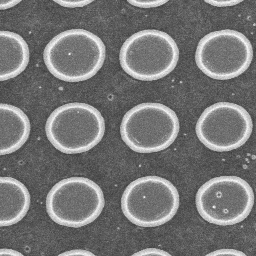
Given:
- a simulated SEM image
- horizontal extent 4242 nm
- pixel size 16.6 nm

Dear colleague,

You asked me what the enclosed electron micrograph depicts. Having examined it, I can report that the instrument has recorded a regular array of raised bodies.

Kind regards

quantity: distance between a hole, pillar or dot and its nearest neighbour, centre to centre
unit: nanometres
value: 1200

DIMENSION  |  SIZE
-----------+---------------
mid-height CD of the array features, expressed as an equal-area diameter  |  825 nm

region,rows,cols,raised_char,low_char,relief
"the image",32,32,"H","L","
HHLLLLLLHHLLLLLLLHHHLLLLLLLHLLLL
LLLLLLLLLLLLLLLLLLLLLLLLLLLLLLLL
LLLLLLLLLLLLLLLLLLLLLLLLLLLLLLLL
LLLLLLLLLLLLLLLLLLLLLLLLLLLLLLLL
HHLLLLLLHHHHLLLLLHHHHLLLLLHHHHLL
HHHLLLHHHHHHHLLLHHHHHHLLLHHHHHHL
HHHLLLHHHHHHHLLHHHHHHHLLLHHHHHHL
HHHLLLHHHHHHHLLHHHHHHHLLLHHHHHHL
HHHLLLHHHHHHLLLLHHHHHLLLLHHHHHHL
HLLLLLLHHHHLLLLLLHHHLLLLLLLHHLLL
LLLLLLLLLLLLLLLLLLLLLLLLLLLLLLLL
LLLLLLLLLLLLLLLLLLLLLLLLLLLLLLLL
LLLLLLLLLLLLLLLLLLLLLLLLLLLLLLLL
HLLLLLLLHHHLLLLLLHHHLLLLLLHHHHLL
HHHLLLLHHHHHLLLLHHHHHHLLLHHHHHHL
HHHLLLHHHHHHHLLHHHHHHHLLLHHHHHHL
HHHLLLHHHHHHHLLHHHHHHHLLLHHHHHHL
HHHLLLLHHHHHLLLLHHHHHLLLLHHHHHLL
HHLLLLLLHHHLLLLLLHHHLLLLLLLHHLLL
LLLLLLLLLLLLLLLLLLLLLLLLLLLLLLLL
LLLLLLLLLLLLLLLLLLLLLLLLLLLLLLLL
LLLLLLLLLLLLLLLLLLLLLLLLLLLLLLLL
HLLLLLLLLLLLLLLLLLHHLLLLLLLHHHLL
HHHLLLLHHHHHLLLLHHHHHHLLLHHHHHHL
HHHLLLHHHHHHHLLLHHHHHHLLLHHHHHHL
HHHLLLHHHHHHHLLHHHHHHHLLLHHHHHHL
HHHLLLHHHHHHLLLLHHHHHHLLLHHHHHHL
HHLLLLLHHHHLLLLLLHHHHLLLLLHHHHLL
LLLLLLLLLLLLLLLLLLLLLLLLLLLLLLLL
LLLLLLLLLLLLLLLLLLLLLLLLLLLLLLLL
LLLLLLLLLLLLLLLLLLLLLLLLLLLLLLLL
HLLLLLLLLLLLLLLLLLHHLLLLLLLHHLLL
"